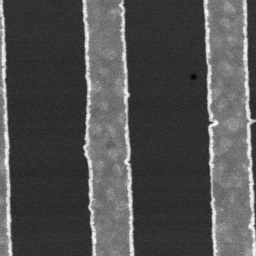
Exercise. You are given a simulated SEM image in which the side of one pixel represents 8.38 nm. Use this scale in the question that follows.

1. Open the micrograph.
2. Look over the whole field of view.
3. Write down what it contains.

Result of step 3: one or a few lines or trenches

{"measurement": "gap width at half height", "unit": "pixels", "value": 80.7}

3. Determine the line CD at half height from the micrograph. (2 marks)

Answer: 340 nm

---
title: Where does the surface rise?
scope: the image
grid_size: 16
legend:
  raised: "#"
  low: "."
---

.....###.....##.
.....###.....##.
.....###.....##.
.....###.....##.
.....###.....##.
.....###.....###
.....###.....###
.....###.....###
.....###.....###
#....###.....###
#.....##.....###
#.....##.....###
#.....##.....###
#.....##.....###
#.....##.....###
#.....##.....###